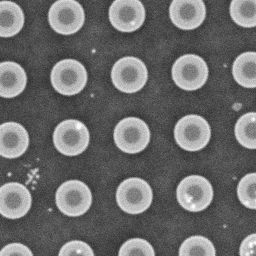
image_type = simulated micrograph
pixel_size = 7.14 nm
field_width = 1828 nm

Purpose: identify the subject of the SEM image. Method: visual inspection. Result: an array of small figures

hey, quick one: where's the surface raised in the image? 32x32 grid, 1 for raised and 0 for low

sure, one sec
11000001110000111100011110000111
11100011110000111100011111000111
11100011110000111100001110000111
11100001110000011000000100000000
10000000000000000000000000000000
00000000000000000000000000000000
00000000000000000000000000000000
00000000100000011000001110000111
11100001110000111100001111000111
11100011111000111100001111000111
11100001111000111100001110000011
11100001110000001000000000000000
00000000000000000000000000000000
00000000000000000000000000000000
00000000000000000000000110000011
01000000110000011100001111000011
11100001111000111110001111000111
11110001111000111110001111000011
11100001111000011100000110000000
11000000000000000000000000000000
00000000000000000000000000000000
00000000000000000000000000000000
00000000000000001100000111000011
11100001111000011110001111000011
11110001111000011110001111100011
11110001111000011110000111000011
11100000111000001100000000000000
00000000000000000000000000000000
00000000000000000000000000000000
00000000000000000000000000000001
01000000111000001110000111000011
11110001111100011110001111100011